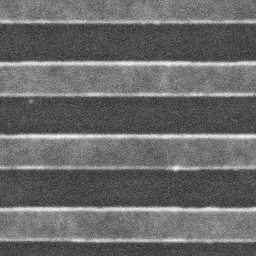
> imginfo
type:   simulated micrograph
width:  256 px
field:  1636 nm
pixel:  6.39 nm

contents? lines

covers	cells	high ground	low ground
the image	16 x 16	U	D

UUUUUUUUUUUUUUUU
DDDDDDDDDDDDDDDD
DDDDDDDDDDDDDDDD
DDDDDDDDDDDDDDDD
UUUUUUUUUUUUUUUU
UUUUUUUUUUUUUUUU
DDDDDDDDDDDDDDDD
DDDDDDDDDDDDDDDD
DUUUUUUUUUUUUUUU
UUUUUUUUUUUUUUUU
UUUUUUUUUUUUUUUU
DDDDDDDDDDDDDDDD
DDDDDDDDDDDDDDDD
UUUUUUUUUUUUUUUU
UUUUUUUUUUUUUUUU
DDDDDDDDDDDDDDDD